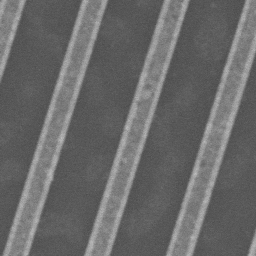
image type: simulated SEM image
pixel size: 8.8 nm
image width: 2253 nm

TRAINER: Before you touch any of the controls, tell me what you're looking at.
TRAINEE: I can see one or a few lines or trenches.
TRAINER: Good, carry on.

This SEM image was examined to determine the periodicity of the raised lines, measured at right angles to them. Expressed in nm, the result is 687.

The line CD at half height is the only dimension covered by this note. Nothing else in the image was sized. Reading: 18.4 pixels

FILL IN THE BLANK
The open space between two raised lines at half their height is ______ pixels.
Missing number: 59.5